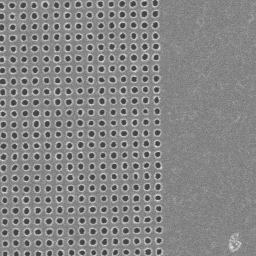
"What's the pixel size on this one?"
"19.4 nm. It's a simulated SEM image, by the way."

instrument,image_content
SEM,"a regular array of holes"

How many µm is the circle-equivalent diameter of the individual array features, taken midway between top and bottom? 0.11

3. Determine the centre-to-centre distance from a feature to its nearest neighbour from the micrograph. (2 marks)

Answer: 204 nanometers